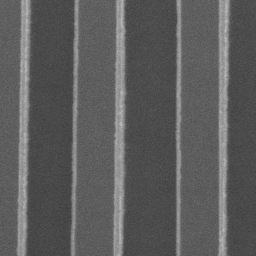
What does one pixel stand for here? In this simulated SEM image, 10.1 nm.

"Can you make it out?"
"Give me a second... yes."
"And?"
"lines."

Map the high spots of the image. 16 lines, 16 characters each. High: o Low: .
oo...ooo...ooo..
oo...ooo...ooo..
oo...ooo...ooo..
oo...ooo...ooo..
oo...ooo...ooo..
oo...ooo...ooo..
oo...ooo...ooo..
oo...ooo...ooo..
oo...ooo...ooo..
oo...ooo...ooo..
oo...ooo...ooo..
oo...ooo...ooo..
oo...ooo...ooo..
oo...ooo...ooo..
oo...ooo...ooo..
oo...ooo...ooo..